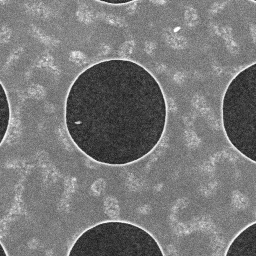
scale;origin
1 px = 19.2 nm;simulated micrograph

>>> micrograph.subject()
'holes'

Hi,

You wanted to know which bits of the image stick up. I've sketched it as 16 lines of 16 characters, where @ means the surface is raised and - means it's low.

@@@@@@@@@@@@@@@@
@@@@@@@@@@@@@@@@
@@@@@@@@@@@@@@@@
@@@@@@@@@@@@@@@@
@@@@@----@@@@@@-
@@@@------@@@@--
-@@@------@@@@--
-@@@------@@@@--
@@@@------@@@@--
@@@@@----@@@@@@-
@@@@@@@@@@@@@@@@
@@@@@@@@@@@@@@@@
@@@@@@@@@@@@@@@@
@@@@@@@@@@@@@@@@
@@@@@----@@@@@@-
@@@@@-----@@@@--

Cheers